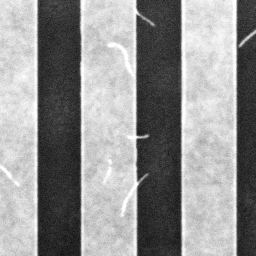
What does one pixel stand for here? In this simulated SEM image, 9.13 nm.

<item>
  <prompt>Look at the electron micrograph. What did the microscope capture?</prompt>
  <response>lines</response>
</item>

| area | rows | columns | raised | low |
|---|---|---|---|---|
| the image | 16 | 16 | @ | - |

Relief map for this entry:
@@---@@@@--@@@@-
@@---@@@---@@@@-
@@---@@@---@@@@-
@@---@@@---@@@@-
@@---@@@---@@@@-
@@---@@@---@@@@-
@@---@@@---@@@@-
@@---@@@---@@@@-
@@---@@@@--@@@@-
@@---@@@---@@@@-
@@---@@@---@@@@-
@@---@@@@--@@@@-
@@---@@@@--@@@@-
@@---@@@---@@@@-
@@---@@@@--@@@@-
@@---@@@@--@@@@-